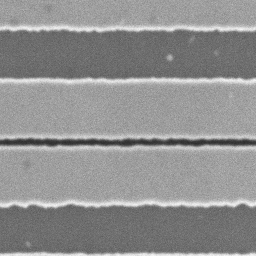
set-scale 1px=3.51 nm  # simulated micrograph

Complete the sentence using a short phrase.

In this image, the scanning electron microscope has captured lines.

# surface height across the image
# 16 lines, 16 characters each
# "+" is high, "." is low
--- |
++++++++++++++++
++++++++++++++++
................
................
................
++++++++++++++++
++++++++++++++++
++++++++++++++++
++++++++++++++++
++++++++++++++++
++++++++++++++++
++++++++++++++++
++++++++++++++++
................
................
................